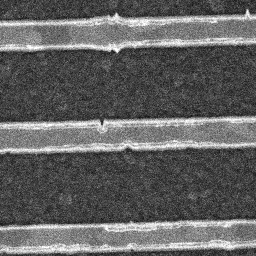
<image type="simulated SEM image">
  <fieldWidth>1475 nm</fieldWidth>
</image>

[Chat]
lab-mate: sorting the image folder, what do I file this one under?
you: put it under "one or a few lines or trenches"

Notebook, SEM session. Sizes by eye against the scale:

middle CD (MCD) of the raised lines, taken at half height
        137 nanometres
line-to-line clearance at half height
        78.1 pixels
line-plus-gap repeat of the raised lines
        0.587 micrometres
